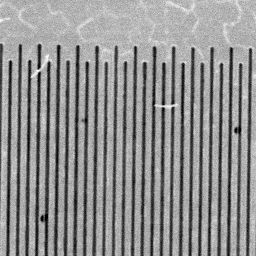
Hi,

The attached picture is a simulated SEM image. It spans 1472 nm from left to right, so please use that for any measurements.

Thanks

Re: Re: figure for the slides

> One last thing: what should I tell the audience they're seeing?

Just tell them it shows parallel lines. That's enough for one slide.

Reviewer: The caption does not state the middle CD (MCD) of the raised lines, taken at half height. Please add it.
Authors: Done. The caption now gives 38.1 nm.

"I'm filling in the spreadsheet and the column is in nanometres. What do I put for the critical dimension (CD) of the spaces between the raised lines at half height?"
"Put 16.5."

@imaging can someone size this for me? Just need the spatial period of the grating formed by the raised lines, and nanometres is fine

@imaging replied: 55.1